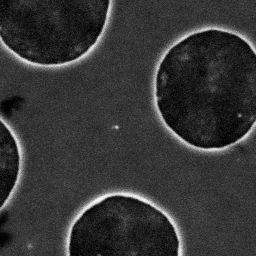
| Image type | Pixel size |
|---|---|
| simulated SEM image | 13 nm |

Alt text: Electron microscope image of holes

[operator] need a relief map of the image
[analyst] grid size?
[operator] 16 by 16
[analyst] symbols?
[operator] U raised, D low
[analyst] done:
DDDDDDDUUUUUUUUU
DDDDDDDUUUUUUUUU
DDDDDDUUUUUDDDDU
UDDDDUUUUUDDDDDD
UUUUUUUUUUDDDDDD
UUUUUUUUUUDDDDDD
UUUUUUUUUUDDDDDD
UUUUUUUUUUDDDDDD
DUUUUUUUUUUDDDDU
DUUUUUUUUUUUUUUU
DUUUUUUUUUUUUUUU
DUUUUUUUUUUUUUUU
UUUUUUDDDUUUUUUU
UUUUUDDDDDUUUUUU
UUUUDDDDDDDUUUUU
UUUUDDDDDDDUUUUU